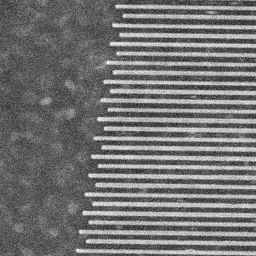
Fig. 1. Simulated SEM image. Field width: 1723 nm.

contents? parallel lines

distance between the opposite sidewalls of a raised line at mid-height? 21 nm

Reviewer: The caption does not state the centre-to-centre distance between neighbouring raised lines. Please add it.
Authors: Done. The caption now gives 63.4 nanometers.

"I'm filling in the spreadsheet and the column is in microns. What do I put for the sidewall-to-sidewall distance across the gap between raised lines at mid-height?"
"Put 0.0429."